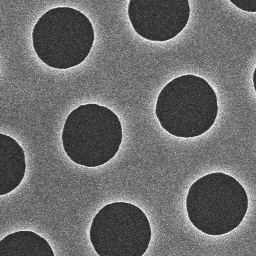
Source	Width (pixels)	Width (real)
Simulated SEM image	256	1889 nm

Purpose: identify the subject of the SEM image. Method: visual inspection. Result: holes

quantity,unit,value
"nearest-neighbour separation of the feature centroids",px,100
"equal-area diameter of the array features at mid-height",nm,456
